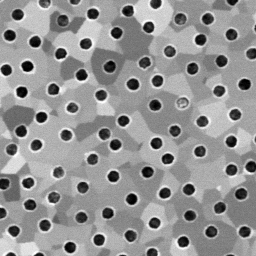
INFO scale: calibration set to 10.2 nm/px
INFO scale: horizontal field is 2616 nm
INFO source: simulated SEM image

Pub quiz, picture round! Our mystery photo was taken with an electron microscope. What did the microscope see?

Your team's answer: a regular array of holes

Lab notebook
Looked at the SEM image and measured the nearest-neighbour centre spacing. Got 26.2 pixels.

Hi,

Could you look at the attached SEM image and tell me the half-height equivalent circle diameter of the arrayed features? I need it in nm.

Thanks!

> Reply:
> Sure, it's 127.